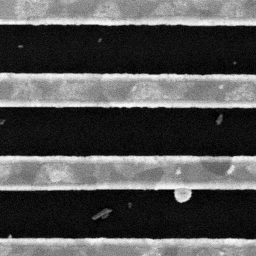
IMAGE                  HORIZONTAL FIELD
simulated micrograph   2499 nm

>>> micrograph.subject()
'lines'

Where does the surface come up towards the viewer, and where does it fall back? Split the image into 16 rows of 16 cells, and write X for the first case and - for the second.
XXXXXXXXXXXXXXXX
----------------
----------------
----------------
----------------
XXXXXXXXXXXXXXXX
XXXXXXXXXXXXXXXX
----------------
----------------
----------------
XXXXXXXXXXXXXXXX
XXXXXXXXXXXXXXXX
----------------
----------------
----------------
XXXXXXXXXXXXXXXX